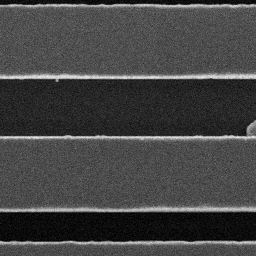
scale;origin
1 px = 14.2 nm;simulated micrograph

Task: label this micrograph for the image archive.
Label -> lines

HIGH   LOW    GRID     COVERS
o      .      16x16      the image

oooooooooooooooo
oooooooooooooooo
oooooooooooooooo
oooooooooooooooo
oooooooooooooooo
................
................
................
....o.o.......o.
oooooooooooooooo
oooooooooooooooo
oooooooooooooooo
oooooooooooooooo
................
................
oooooooooooooooo